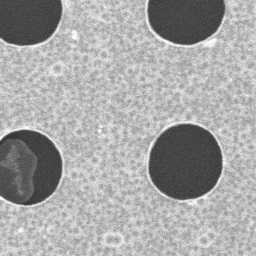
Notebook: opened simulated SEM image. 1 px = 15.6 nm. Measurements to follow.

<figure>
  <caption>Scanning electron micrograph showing holes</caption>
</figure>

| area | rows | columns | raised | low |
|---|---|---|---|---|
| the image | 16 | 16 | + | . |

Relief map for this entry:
....+++++.....++
....+++++.....++
...+++++++...+++
++++++++++++++++
++++++++++++++++
++++++++++++++++
++++++++++++++++
++++++++++++++++
...+++++++...+++
....+++++.....++
....+++++.....++
....++++++...+++
...++++++++.++++
++++++++++++++++
++++++++++++++++
++++++++++++++++